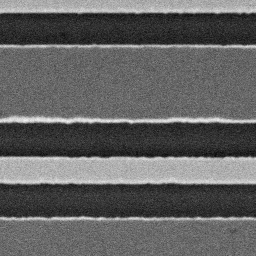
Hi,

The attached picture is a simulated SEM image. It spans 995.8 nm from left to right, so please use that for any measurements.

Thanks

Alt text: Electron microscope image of lines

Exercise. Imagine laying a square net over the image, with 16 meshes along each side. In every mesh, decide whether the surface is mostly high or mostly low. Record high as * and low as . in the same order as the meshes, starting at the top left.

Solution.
................
................
................
****************
****************
****************
****************
****************
................
................
................
................
................
................
****************
****************